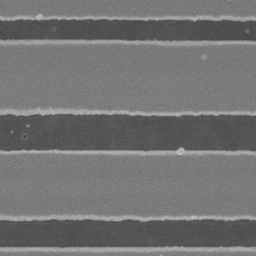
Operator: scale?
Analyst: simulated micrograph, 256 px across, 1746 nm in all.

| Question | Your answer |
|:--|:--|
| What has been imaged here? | lines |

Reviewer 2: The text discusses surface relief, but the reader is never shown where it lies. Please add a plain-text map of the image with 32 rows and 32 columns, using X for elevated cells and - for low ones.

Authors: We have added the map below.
XXXXXXXXXXXXXXXXXXXXXXXXXXXXXXXX
XXXXXXXXXXXXXXXXXXXXXXXXXXXXXXXX
XX----------------------X-XX-XXX
--------------------------------
--------------------------------
XXXXXXXXXXXXXXXXXXXXXXXXXXXXXXXX
XXXXXXXXXXXXXXXXXXXXXXXXXXXXXXXX
XXXXXXXXXXXXXXXXXXXXXXXXXXXXXXXX
XXXXXXXXXXXXXXXXXXXXXXXXXXXXXXXX
XXXXXXXXXXXXXXXXXXXXXXXXXXXXXXXX
XXXXXXXXXXXXXXXXXXXXXXXXXXXXXXXX
XXXXXXXXXXXXXXXXXXXXXXXXXXXXXXXX
XXXXXXXXXXXXXXXXXXXXXXXXXXXXXXXX
XXXXXXXXXXXXXXXXXXXXXXXXXXXXXXXX
--------------------------------
--------------------------------
--------------------------------
--------------------------------
--------------------------------
XXXXXXXXXXXXXXXXXXXXXXXXXXXXXXXX
XXXXXXXXXXXXXXXXXXXXXXXXXXXXXXXX
XXXXXXXXXXXXXXXXXXXXXXXXXXXXXXXX
XXXXXXXXXXXXXXXXXXXXXXXXXXXXXXXX
XXXXXXXXXXXXXXXXXXXXXXXXXXXXXXXX
XXXXXXXXXXXXXXXXXXXXXXXXXXXXXXXX
XXXXXXXXXXXXXXXXXXXXXXXXXXXXXXXX
XXXXXXXXXXXXXXXXXXXXXXXXXXXXXXXX
-XXX---------XX--XX---------X---
--------------------------------
--------------------------------
--------------------------------
XXXXXXXXXXXXXXXXXXXXXXXXXXXXXXXX